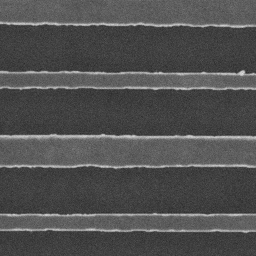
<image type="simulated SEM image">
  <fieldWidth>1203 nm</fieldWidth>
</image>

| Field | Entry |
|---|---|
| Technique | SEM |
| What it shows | lines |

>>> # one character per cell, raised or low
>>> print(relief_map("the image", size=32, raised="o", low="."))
oooooooooooooooooooooooooooooooo
oooooooooooooooooooooooooooooooo
oooooooooooooooooooooooooooooooo
................................
................................
................................
................................
................................
................................
oooooooooooooooooooooooooooooooo
oooooooooooooooooooooooooooooooo
................................
................................
................................
................................
................................
................................
oooooooooooooooooooooooooooooooo
oooooooooooooooooooooooooooooooo
oooooooooooooooooooooooooooooooo
oooooooooooooooooooooooooooooooo
................................
................................
................................
................................
................................
................................
oooooooooooooooooooooooooooooooo
oooooooooooooooooooooooooooooooo
................................
................................
................................